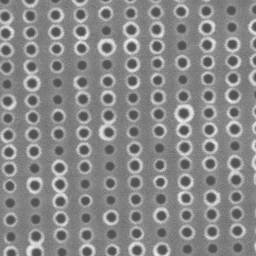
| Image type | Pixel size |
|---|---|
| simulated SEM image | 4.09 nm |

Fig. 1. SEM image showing a regular array of holes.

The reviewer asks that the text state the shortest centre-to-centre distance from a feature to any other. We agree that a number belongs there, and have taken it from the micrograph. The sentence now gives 69.1 nanometers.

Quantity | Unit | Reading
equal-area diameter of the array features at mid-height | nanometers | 36.1